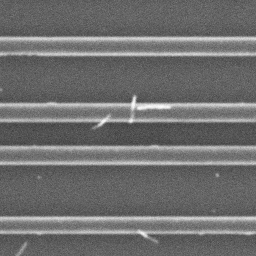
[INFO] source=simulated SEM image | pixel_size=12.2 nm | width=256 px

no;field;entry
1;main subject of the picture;lines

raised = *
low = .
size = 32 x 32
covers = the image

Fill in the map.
................................
................................
................................
................................
................................
********************************
********************************
................................
................................
................................
................................
................................
................................
********************************
********************************
................................
................................
................................
********************************
********************************
................................
................................
................................
................................
................................
................................
................................
********************************
********************************
................................
................................
................................